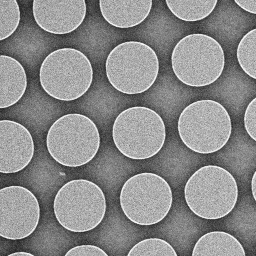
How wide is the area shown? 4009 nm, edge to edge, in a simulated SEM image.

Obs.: an array of small figures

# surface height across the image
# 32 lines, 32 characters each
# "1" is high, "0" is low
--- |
11001111111001111110011111100011
11001111111001111110001111000001
11001111110001111100000110000000
11000111100000000000000000000000
10000000000000000000000011000001
00000000000000011100001111100011
00000001110000111110001111110011
11000011111001111111001111110011
11100111111001111111001111110011
11100111111101111111001111100001
11100111111000111110000111000000
11100011111000011100000000000000
11000000100000000000000000000000
00000000000000001100000111110001
00000000110000011111000111111001
11000001111100111111001111111001
11110011111100111111101111111001
11110011111100111111100111110000
11110011111100011111000011110000
11110001111100001110000000000000
11100000110000000000000000000000
11000000000000000000000001110000
00000000000000001111000011111000
01100000111100011111100111111100
11110001111110011111100111111100
11111001111110011111100111111000
11111001111110001111100011111000
11111001111110001111000000000000
11110000111100000000000000000000
11100000000000000000000001111000
00000000000000000111100001111100
00000000011110001111110011111110